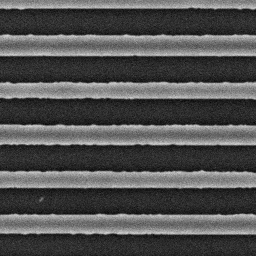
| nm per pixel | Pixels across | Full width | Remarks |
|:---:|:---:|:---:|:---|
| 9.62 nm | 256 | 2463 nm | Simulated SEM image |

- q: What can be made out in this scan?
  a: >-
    lines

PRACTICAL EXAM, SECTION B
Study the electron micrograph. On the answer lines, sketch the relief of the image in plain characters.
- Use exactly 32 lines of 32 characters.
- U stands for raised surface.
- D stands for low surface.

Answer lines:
UUUUUUUUUUUUUUUUUUUUUUUUUUUUUUUU
DDDDDDDDDDDDDDDDDDDDDDDDDDDDDDDD
DDDDDDDDDDDDDDDDDDDDDDDDDDDDDDDD
DDDDDDDDDDDDDDDDDDDDDDDDDDDDDDDD
UUDUDDDUDUUUDDDUDDDDUDDDDUUDDUUD
UUUUUUUUUUUUUUUUUUUUUUUUUUUUUUUU
UUUUUUUUUUUUUUUUUUUUUUUUUUUUUUUU
DDDDDDDDDDDDDDDDDDDDDDDDDDDDDDDD
DDDDDDDDDDDDDDDDDDDDDDDDDDDDDDDD
DDDDDDDDDDDDDDDDDDDDDDDDDDDDDDDD
UUUUUUUUUUUUUUUUUUUUUUUUUUUUUUUU
UUUUUUUUUUUUUUUUUUUUUUUUUUUUUUUU
DDDDDDDDDDDDDDDDDDDDDDDDDDDDDDDD
DDDDDDDDDDDDDDDDDDDDDDDDDDDDDDDD
DDDDDDDDDDDDDDDDDDDDDDDDDDDDDDDD
DDDDDDDDDDDDDDDDDDDDDDDDDDDDDDDD
UUUUUUUUUUUUUUUUUUUUUUUUUUUUUUUU
UUUUUUUUUUUUUUUUUUUUUUUUUUUUUUUU
DDDDDDDDDDDDDDDDDDDDDDDDDDDDDDDD
DDDDDDDDDDDDDDDDDDDDDDDDDDDDDDDD
DDDDDDDDDDDDDDDDDDDDDDDDDDDDDDDD
UUUUUUUUUUUUUUDDUUUDUUUDUUUUUUUD
UUUUUUUUUUUUUUUUUUUUUUUUUUUUUUUU
DDDDDDDDDDUDDDDDDDDDDDUDDDDDDDDD
DDDDDDDDDDDDDDDDDDDDDDDDDDDDDDDD
DDDDDDDDDDDDDDDDDDDDDDDDDDDDDDDD
DDDDDDDDDDDDDDDDDDDDDDDDDDDDDDDD
UUUUUUUUUUUUUUUUUUUUUUUUUUUUUUUU
UUUUUUUUUUUUUUUUUUUUUUUUUUUUUUUU
DDDDDDDDDDDDDDDDDDDDDDDDDDDDDDDD
DDDDDDDDDDDDDDDDDDDDDDDDDDDDDDDD
DDDDDDDDDDDDDDDDDDDDDDDDDDDDDDDD